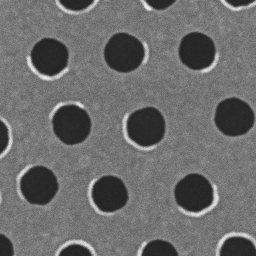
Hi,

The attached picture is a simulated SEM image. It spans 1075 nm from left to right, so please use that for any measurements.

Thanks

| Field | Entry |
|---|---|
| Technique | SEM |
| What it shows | a regular array of holes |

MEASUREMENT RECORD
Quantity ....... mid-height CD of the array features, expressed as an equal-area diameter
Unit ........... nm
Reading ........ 162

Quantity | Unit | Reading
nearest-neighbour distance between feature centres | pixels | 72.8